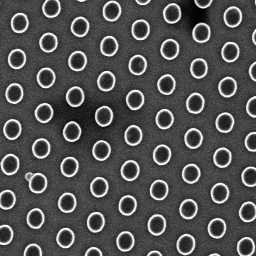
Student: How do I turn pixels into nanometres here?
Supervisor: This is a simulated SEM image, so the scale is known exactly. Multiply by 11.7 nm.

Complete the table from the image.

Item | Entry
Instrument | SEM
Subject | a regular array of raised bodies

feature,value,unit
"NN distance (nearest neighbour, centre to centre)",403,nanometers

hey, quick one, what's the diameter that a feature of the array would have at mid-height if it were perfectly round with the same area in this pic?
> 0.21 um